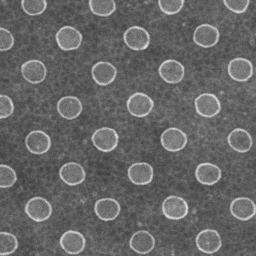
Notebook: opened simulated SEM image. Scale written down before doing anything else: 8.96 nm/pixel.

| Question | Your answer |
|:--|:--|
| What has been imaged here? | a regular array of raised bodies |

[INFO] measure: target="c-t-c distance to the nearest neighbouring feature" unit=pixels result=47.5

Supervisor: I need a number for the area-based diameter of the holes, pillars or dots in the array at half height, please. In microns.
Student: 0.205